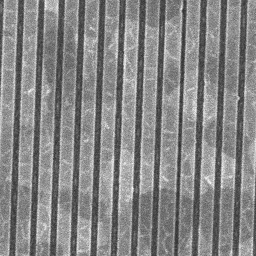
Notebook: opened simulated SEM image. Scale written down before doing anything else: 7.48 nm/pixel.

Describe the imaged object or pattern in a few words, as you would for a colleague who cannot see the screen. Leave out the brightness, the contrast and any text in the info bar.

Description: parallel lines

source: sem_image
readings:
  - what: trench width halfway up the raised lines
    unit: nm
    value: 57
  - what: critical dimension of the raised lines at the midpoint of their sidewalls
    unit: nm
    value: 95.3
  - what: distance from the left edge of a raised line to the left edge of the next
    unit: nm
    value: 152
